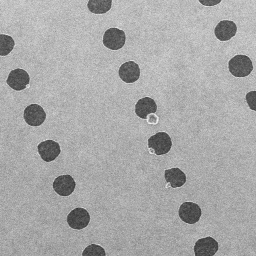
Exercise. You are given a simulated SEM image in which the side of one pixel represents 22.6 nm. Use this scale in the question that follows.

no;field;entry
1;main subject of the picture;a regular array of raised bodies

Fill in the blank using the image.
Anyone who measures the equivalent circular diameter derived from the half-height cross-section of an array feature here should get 0.532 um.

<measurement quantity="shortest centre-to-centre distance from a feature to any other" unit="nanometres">839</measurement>